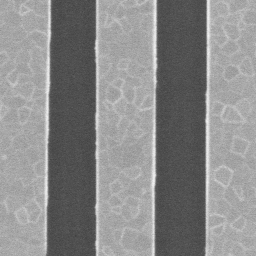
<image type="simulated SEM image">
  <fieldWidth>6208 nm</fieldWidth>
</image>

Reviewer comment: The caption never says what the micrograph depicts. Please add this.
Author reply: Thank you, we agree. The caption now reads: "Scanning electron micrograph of lines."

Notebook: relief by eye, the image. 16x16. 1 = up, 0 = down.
1110001111000111
1110001111000111
1110001111000111
1110001111000111
1110001111000111
1110001111000111
1110001111000111
1110001111000111
1110001111000111
1110001111000111
1110001111000111
1110001111000111
1110001111000111
1110001111000111
1110001111000111
1110001111000111